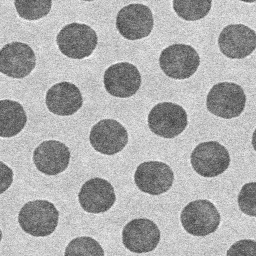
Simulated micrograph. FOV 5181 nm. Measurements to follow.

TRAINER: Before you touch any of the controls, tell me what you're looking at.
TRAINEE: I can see a regular array of holes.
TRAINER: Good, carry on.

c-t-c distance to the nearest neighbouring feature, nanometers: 1200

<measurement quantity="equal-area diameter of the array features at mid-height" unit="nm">770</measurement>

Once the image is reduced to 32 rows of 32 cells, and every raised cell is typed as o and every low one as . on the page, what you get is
oo.....ooooooooo..oooo....oooooo
oo....ooooooooo....ooo....oooooo
ooo.oooooooooo.....oooo..ooooooo
oooooooo...oooo....ooooooooo...o
ooooooo.....ooo...ooooooooo.....
o..oooo.....oooooooooo.oooo.....
....oooo....oooooooo.....ooo....
....oooooooooooooooo.....ooooooo
....ooooooooo....ooo.....ooooooo
o..oooooooooo.....ooo...oooooooo
ooooooo..oooo.....ooooooooo...oo
oooooo....ooo....ooooooooo.....o
.ooooo....oooooooooooooooo.....o
...ooo....ooooooooo....ooo.....o
...ooooooooooooooo.....oooo...oo
...ooooooooo...ooo.....ooooooooo
..ooooooooo.....ooo....ooooooooo
oooooo.oooo.....ooooooooooooooo.
oooo.....ooo...ooooooooo....oooo
oooo.....ooooooooooooooo.....ooo
.ooo.....ooooooooo...ooo.....ooo
..ooo...ooooooooo.....oo....oooo
..ooooooooo..oooo.....oooooooooo
.ooooooooo....ooo....ooooooooo..
oooooooooo....oooooooooooooooo..
ooo....ooo....ooooooooo....ooo..
oo.....oooo..oooooooooo....ooo..
oo.....ooooooooo...oooo.....oooo
ooo....oooooooo.....ooo....ooooo
oooo..ooooooooo.....oooo..oooooo
ooooooooo...ooo.....ooooooooo...
oooooooo.....ooo...ooooooooo....